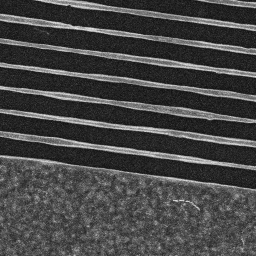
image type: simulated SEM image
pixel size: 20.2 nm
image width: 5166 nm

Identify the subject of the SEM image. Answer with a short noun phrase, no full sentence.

parallel lines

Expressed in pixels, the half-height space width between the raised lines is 18.7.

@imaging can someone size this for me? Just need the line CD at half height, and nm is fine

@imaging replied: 100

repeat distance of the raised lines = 467 nanometers